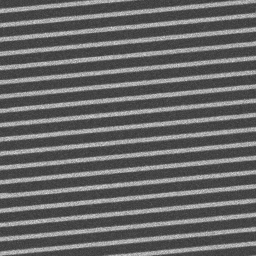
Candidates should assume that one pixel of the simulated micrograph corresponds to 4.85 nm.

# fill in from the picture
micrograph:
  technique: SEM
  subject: parallel lines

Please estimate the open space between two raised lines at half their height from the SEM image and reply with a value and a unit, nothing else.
48.2 nanometers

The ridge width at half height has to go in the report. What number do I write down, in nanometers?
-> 21.7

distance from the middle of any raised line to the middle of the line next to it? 68.8 nm